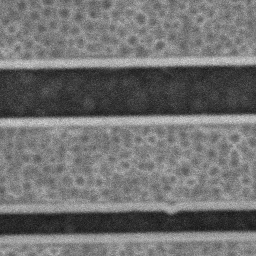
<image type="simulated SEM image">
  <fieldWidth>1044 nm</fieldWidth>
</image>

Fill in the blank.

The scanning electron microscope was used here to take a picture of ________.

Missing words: one or a few lines or trenches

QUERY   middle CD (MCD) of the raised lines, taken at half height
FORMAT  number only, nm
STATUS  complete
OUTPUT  350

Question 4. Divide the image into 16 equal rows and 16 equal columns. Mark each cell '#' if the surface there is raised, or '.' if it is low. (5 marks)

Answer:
################
################
################
################
................
................
................
...............#
################
################
################
################
################
................
................
################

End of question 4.